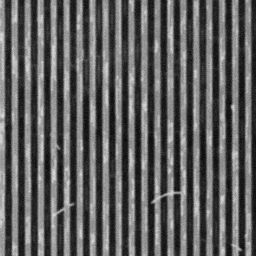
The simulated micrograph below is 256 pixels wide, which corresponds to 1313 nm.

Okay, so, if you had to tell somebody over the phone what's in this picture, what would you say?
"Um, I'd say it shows parallel lines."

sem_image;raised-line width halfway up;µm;0.0263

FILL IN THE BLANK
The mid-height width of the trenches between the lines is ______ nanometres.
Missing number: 39.1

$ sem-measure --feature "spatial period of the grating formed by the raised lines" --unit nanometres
66.5